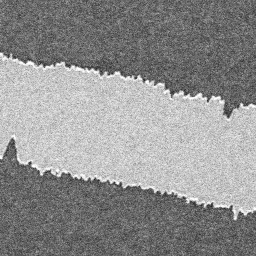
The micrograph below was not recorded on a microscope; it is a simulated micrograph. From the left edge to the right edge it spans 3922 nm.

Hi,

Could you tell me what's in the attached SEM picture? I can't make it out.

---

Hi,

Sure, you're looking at one or a few lines or trenches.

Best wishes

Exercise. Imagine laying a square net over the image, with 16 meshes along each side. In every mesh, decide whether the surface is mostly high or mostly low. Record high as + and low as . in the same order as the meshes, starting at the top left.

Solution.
................
................
................
................
++++++..........
++++++++++......
++++++++++++++..
++++++++++++++++
++++++++++++++++
.+++++++++++++++
..++++++++++++++
........++++++++
............++++
................
................
................